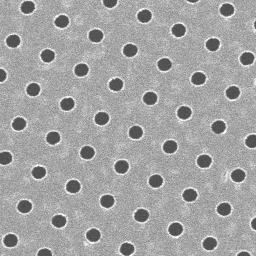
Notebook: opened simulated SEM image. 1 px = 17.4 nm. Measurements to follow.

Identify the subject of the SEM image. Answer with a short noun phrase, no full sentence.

a regular array of holes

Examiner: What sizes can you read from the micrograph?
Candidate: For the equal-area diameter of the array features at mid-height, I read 0.25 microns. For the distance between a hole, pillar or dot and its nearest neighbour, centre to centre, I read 640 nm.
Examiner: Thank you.